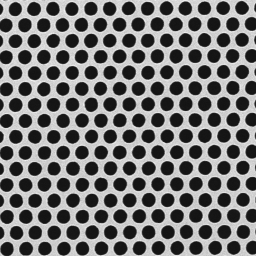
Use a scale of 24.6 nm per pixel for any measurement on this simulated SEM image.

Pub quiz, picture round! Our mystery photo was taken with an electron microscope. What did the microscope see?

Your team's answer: a regular array of holes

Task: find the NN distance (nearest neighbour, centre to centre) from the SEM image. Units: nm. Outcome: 450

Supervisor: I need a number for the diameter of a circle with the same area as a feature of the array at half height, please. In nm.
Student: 344